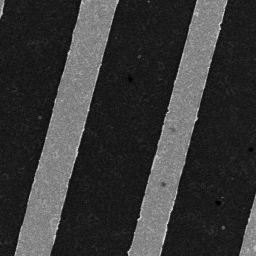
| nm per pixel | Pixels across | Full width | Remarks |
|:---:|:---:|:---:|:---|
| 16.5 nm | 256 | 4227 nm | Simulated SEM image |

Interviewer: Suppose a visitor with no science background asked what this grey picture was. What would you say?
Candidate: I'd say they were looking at one or a few lines or trenches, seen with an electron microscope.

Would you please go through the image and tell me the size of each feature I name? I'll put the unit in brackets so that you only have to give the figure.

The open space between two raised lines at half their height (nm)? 1260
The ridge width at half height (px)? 32.3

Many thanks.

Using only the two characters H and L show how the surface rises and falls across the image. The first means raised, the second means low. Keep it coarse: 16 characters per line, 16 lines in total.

LLLLLHHLLLLLHHLL
LLLLLHHLLLLLHHLL
LLLLLHHLLLLLHHLL
LLLLHHLLLLLHHLLL
LLLLHHLLLLLHHLLL
LLLLHHLLLLLHHLLL
LLLHHHLLLLLHLLLL
LLLHHLLLLLHHLLLL
LLLHHLLLLLHHLLLL
LLLHHLLLLLHHLLLL
LLHHHLLLLLHLLLLL
LLHHLLLLLHHLLLLL
LLHHLLLLLHHLLLLL
LLHHLLLLLHHLLLLL
LHHHLLLLHHLLLLLH
LHHLLLLLHHLLLLLH